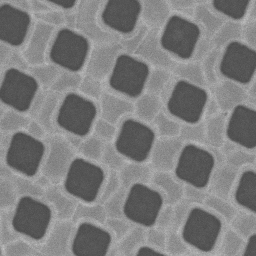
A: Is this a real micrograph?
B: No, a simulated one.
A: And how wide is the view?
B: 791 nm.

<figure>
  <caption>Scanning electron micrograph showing a regular array of holes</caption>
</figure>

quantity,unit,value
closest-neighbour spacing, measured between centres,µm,0.197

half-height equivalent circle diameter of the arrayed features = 125 nanometres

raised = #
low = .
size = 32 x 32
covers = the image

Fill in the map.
.######..####.....########.....#
...##########.....#########....#
....#########....####...#####.##
....##########...####....#######
...####....#########.....#######
#..####....#########.....###..##
######.....##########...####....
######.....####...##########....
#.######..####.....########.....
....##########.....#########....
.....#########....####..######.#
.....##########...###.....######
....####...##########.....######
#...###.....#########.....###..#
#######.....##########...####...
#######.....###...##########....
##.######..####....#########....
#....##########....##########...
#.....########.....####..######.
#....##########....###.....#####
#....####...##########.....#####
##...###.....#########.....###..
########.....##########...####..
########.....###...###########..
###.#####...####....#########...
##....##########....##########..
##....#########.....####..######
##....##########....###....#####
##....####...##########.....####
###...###.....#########....####.
#########.....#########....####.
#########....####...##########..